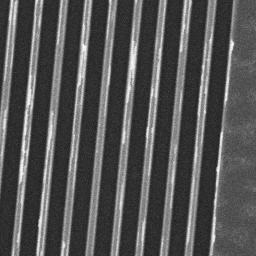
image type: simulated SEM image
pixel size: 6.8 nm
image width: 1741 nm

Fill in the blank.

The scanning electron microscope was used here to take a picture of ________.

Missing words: parallel lines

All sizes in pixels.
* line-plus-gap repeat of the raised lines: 24.6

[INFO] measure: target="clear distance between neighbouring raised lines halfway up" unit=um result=0.121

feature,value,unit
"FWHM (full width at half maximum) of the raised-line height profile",0.0474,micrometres